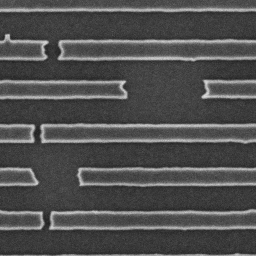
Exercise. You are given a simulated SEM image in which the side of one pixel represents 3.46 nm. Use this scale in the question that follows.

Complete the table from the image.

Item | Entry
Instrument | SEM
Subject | parallel lines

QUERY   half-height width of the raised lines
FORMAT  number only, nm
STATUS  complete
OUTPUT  59.3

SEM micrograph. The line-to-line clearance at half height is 93.4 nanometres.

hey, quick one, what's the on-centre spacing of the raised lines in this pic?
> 148 nm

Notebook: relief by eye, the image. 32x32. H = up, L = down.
HHHHHHHHHHHHHHHHHHHHHHHHHHHHHHHH
LLLLLLLLLLLLLLLLLLLLLLLLLLLLLLLL
LLLLLLLLLLLLLLLLLLLLLLLLLLLLLLLL
LLLLLLLLLLLLLLLLLLLLLLLLLLLLLLLL
LLLLLLLLLLLLLLLLLLLLLLLLLLLLLLLL
HHHHHHLHHHHHHHHHHHHHHHHHHHHHHHHH
HHHHHHLLHHHHHHHHHHHHHHHHHHHHHHHH
LLLLLLLLLLLLLLLLLLLLLLLLLLLLLLLL
LLLLLLLLLLLLLLLLLLLLLLLLLLLLLLLL
LLLLLLLLLLLLLLLLLLLLLLLLLLLLLLLL
HHHHHHHHHHHHHHHLLLLLLLLLLLHHHHHH
HHHHHHHHHHHHHHHHLLLLLLLLLLHHHHHH
LLLLLLLLLLLLLLLLLLLLLLLLLLLLLLLL
LLLLLLLLLLLLLLLLLLLLLLLLLLLLLLLL
LLLLLLLLLLLLLLLLLLLLLLLLLLLLLLLL
LLLLLLLLLLLLLLLLLLLLLLLLLLLLLLLL
HHHHLHHHHHHHHHHHHHHHHHHHHHHHHHHH
HHHHLHHHHHHHHHHHHHHHHHHHHHHHHHHH
LLLLLLLLLLLLLLLLLLLLLLLLLLLLLLLL
LLLLLLLLLLLLLLLLLLLLLLLLLLLLLLLL
LLLLLLLLLLLLLLLLLLLLLLLLLLLLLLLL
HHHHLLLLLLHHHHHHHHHHHHHHHHHHHHHH
HHHHHLLLLLHHHHHHHHHHHHHHHHHHHHHH
LLLLLLLLLLLLLLLLLLLLLLLLLLLLLLLL
LLLLLLLLLLLLLLLLLLLLLLLLLLLLLLLL
LLLLLLLLLLLLLLLLLLLLLLLLLLLLLLLL
LLLLLLLLLLLHHLLLLLLLLLHHHLLLLHHH
HHHHHLHHHHHHHHHHHHHHHHHHHHHHHHHH
HHHHHLLHHHHHHHHHHHHHHHHHHHHHHHLL
LLLLLLLLLLLLLLLLLLLLLLLLLLLLLLLL
LLLLLLLLLLLLLLLLLLLLLLLLLLLLLLLL
LLLLLLLLLLLLLLLLLLLLLLLLLLLLLLLL